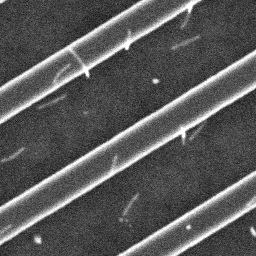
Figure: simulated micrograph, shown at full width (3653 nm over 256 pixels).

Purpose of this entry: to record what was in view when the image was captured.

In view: lines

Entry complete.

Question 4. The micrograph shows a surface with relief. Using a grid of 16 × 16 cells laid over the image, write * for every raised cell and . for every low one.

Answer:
........****....
.......***......
.....***........
...****........*
..***.........**
****........****
**.........***..
.........****...
.......****.....
......***.......
....****........
..****.........*
.****........***
***........****.
*.........***...
........****....